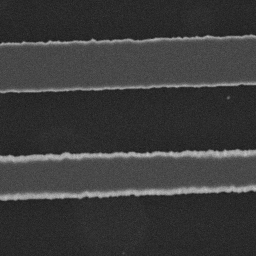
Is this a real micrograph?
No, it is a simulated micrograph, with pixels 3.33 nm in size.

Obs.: lines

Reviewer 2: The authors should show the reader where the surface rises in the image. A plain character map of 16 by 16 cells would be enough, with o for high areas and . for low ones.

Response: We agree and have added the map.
................
................
.......o.ooooooo
oooooooooooooooo
oooooooooooooooo
oooooooooo......
................
................
................
...........ooooo
oooooooooooooooo
oooooooooooooooo
o...............
................
................
................